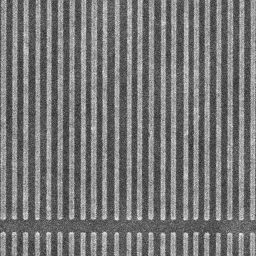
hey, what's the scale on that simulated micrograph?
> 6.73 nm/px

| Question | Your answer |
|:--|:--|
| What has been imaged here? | parallel lines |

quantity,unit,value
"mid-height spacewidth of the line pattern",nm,50.5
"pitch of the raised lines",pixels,11.4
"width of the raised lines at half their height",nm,26.9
